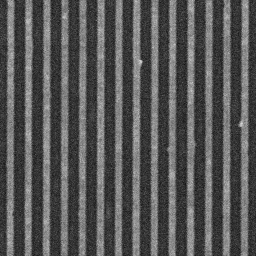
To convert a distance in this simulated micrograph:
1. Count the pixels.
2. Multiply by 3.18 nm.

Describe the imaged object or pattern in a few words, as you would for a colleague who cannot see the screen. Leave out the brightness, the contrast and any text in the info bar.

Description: parallel lines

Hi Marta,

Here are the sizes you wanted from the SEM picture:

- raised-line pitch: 0.0573 µm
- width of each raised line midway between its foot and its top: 19.9 nm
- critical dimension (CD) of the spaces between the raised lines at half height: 37.4 nm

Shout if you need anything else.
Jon